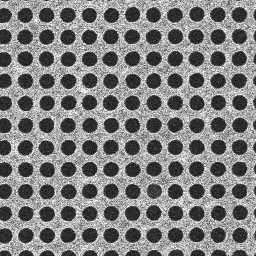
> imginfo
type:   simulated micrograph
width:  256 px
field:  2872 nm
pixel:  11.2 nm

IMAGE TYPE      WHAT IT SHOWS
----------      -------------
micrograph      a regular array of holes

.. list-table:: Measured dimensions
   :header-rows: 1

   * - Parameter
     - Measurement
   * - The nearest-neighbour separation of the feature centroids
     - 236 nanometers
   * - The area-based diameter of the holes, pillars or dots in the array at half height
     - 171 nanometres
